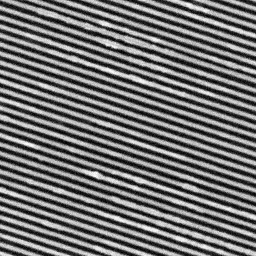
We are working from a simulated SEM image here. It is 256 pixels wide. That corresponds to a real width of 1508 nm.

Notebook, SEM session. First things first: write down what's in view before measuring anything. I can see parallel lines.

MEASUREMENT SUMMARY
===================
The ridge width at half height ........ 21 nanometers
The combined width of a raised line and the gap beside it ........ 51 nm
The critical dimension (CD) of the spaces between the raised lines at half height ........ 5.23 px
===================